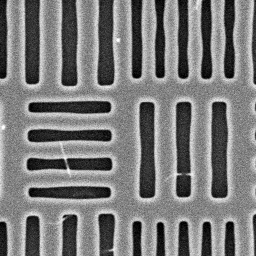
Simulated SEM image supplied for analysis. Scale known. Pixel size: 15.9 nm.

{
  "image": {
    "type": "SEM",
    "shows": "groups of lines, slits or small figures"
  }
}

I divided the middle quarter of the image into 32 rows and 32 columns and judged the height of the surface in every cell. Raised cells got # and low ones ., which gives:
...#####.....####...###..###...#
...#####.....####...###..###...#
...#####.....####...###..###...#
...#####.....####..####..####..#
...#####.....###################
...######.######################
################################
################################
################################
...........########...#######..#
............#######....#####....
............#######....#####....
####...############....#####....
###################....#####....
###################....#####....
###################....#####....
...........########....#####....
............#######....#####....
............#######....#####....
###################....#####....
###################....#####....
###################....#####....
###################....#####....
#...........#######....#####....
............#######....#####....
............#######....#####....
##..........#######....#####....
###################....######..#
###################....#####....
###################....#####....
........###########....#####....
............#######....#####....